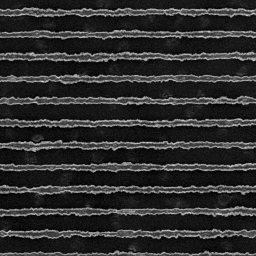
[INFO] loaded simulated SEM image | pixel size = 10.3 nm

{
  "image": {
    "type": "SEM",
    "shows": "parallel lines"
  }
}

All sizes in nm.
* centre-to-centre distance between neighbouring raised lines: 228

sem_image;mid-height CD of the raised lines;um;0.0578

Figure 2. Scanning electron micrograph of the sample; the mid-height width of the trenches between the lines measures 171 nanometers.